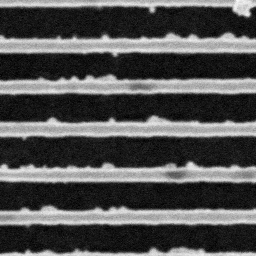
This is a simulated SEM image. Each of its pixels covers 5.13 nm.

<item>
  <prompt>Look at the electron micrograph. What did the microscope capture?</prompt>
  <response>lines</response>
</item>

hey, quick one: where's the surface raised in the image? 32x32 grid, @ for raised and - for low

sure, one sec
@@@@@@@@@@@@@@@@@@@@@@@@@@@@@@@@
-----------------------------@@-
--------------------------------
--------------------------------
--------------------------------
@@@@@@@@@@@@@@@@@@@@@@@@@@@@@@@@
@@@@@@@@@@@@--@@-@-----@@@@@-@@@
--------------------------------
--------------------------------
--------------------------------
@@@@@@@@@@@@@@@@@@@@@@@@@@@@@@@@
@@@@@@@@@@@@@@@@@@@@@@@@@@@@@@@@
--------------------------------
--------------------------------
--------------------------------
@@@@@@@@@@@@@@@@@@@@@@@@@-@@@@@@
@@@@@@@@@@@@@@@@@@@@@@@@@@@@@@@@
--------------------------------
--------------------------------
--------------------------------
--------------------------------
@@@@@@@@@@@@@@@@@@@@@@@@@@@@@@@@
@@@@@@@@@@@@@@@@@@@@@@@@@@@@@@@@
--------------------------------
--------------------------------
--------------------------------
@@@@@@@@@@@@@@@@@@@@@@@@@@@@@@@@
@@@@@@@@@@@@@@@@@@@@@@@@@@@@@@@@
--------------------------------
--------------------------------
--------------------------------
--------------------------------